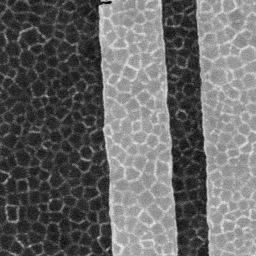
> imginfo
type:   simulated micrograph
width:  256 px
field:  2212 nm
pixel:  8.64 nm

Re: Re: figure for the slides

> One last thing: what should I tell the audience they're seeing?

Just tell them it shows one or a few lines or trenches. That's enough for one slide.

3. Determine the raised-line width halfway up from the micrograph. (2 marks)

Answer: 0.545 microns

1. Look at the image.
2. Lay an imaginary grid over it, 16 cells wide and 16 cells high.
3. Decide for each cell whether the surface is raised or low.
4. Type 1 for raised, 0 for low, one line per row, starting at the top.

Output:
0000001111001111
0000001111001111
0000001111001111
0000001111000111
0000001111000111
0000000111000111
0000000111000111
0000000111100111
0000000111100111
0000000111100111
0000000111000111
0000000111100111
0000000111100111
0000000111100111
0000000111100111
0000000111100111